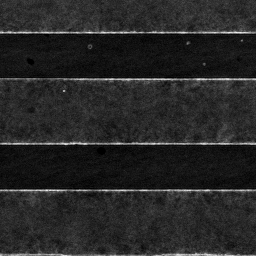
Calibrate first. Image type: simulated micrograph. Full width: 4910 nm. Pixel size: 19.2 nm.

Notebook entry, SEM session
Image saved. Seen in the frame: lines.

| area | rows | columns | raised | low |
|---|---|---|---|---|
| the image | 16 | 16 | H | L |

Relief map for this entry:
HHHHHHHHHHHHHHHH
HHHHHHHHHHHHHHHH
LLLLLLLLLLLLLLLL
LLLLLLLLLLLLLLLL
LLLLLLLLLLLLLLLL
HHHHHHHHHHHHHHHH
HHHHHHHHHHHHHHHH
HHHHHHHHHHHHHHHH
HHHHHHHHHHHHHHHH
LLLLLLLLLLLLLLLL
LLLLLLLLLLLLLLLL
LLLLLLLLLLLLLLLL
HHHHHHHHHHHHHHHH
HHHHHHHHHHHHHHHH
HHHHHHHHHHHHHHHH
HHHHHHHHHHHHHHHH